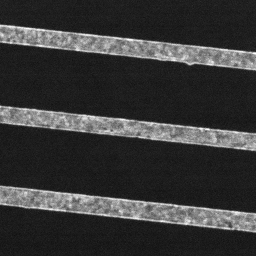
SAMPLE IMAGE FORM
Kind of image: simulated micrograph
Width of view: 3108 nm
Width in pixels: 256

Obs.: one or a few lines or trenches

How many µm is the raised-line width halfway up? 0.201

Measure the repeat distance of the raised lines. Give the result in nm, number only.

975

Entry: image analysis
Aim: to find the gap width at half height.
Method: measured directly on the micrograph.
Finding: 778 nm